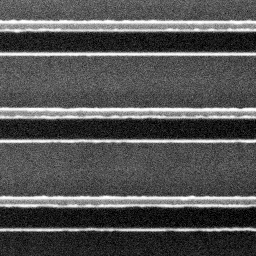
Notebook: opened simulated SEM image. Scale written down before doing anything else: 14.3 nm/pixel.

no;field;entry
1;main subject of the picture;lines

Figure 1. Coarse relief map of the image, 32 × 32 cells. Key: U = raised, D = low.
DDDDDDDDDDDDDDDDDDDDDDDDDDDDDDDD
DDDDDDDDDDDDDDDDDDDDDDDDDDDDDDDD
DDDDDDDDDDDDDDDDDDDDDDDDDDDDDDDD
UUUUUUUUUUUUUUUUUUUUUUUUUUUUUUUU
UUUUUUUUUUUUUUUUUUUUUUUUUUUUUUUU
UUUUUUUUUUUUUUUUUUUUUUUUUUUUUUUU
UUUUUUUUUUUUUUUUUUUUUUUUUUUUUUUU
DDDDDDDDDDDDDDDDDDDDDDDDDDDDDDDD
DDDDDDDDDDDDDDDDDDDDDDDDDDDDDDDD
DDDDDDDDDDDDDDDDDDDDDDDDDDDDDDDD
DDDDDDDDDDDDDDDDDDDDDDDDDDDDDDDD
DDDDDDDDDDDDDDDDDDDDDDDDDDDDDDDD
DDDDDDDDDDDDDDDDDDDDDDDDDDDDDDDD
DDDDDDDDDDDDDDDDDDDDDDDDDDDDDDDD
UUUUUUUUUUUUUUUUUUUUUUUUUUUUUUUU
UUUUUUUUUUUUUUUUUUUUUUUUUUUUUUUU
UUUUUUUUUUUUUUUUUUUUUUUUUUUUUUUU
UUUUUUUUUUUUUUUUUUUUUUUUUUUUUUUU
DDDDDDDDDDDDDDDDDDDDDDDDDDDDDDDD
DDDDDDDDDDDDDDDDDDDDDDDDDDDDDDDD
DDDDDDDDDDDDDDDDDDDDDDDDDDDDDDDD
DDDDDDDDDDDDDDDDDDDDDDDDDDDDDDDD
DDDDDDDDDDDDDDDDDDDDDDDDDDDDDDDD
DDDDDDDDDDDDDDDDDDDDDDDDDDDDDDDD
DDDDDDDDDDDDDDDDDDDDDDDDDDDDDDDD
UUUUUUUUUUUUUUUUUUUUUUUUUUUUUUUU
UUUUUUUUUUUUUUUUUUUUUUUUUUUUUUUU
UUUUUUUUUUUUUUUUUUUUUUUUUUUUUUUU
UUUUUUUUUUUUUUUUUUUUUUUUUUUUUUUU
DDDDDDDDDDDDDDDDDDDDDDDDDDDDDDDD
DDDDDDDDDDDDDDDDDDDDDDDDDDDDDDDD
DDDDDDDDDDDDDDDDDDDDDDDDDDDDDDDD